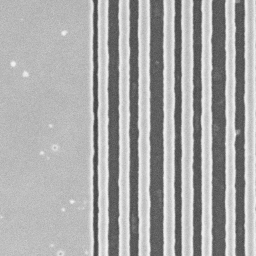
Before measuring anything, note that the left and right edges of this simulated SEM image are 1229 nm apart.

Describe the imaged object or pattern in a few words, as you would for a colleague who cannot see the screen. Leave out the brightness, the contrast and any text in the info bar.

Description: parallel lines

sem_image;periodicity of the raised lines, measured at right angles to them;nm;102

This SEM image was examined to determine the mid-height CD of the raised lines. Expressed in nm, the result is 48.6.